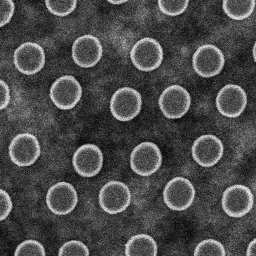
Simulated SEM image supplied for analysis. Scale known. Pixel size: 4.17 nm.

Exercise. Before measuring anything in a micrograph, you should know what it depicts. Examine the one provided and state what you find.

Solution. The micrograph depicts a regular array of raised bodies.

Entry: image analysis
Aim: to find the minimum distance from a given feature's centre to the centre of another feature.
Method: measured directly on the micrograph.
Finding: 201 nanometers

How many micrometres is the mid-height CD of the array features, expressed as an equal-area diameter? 0.125